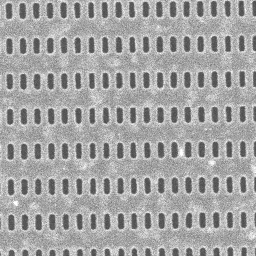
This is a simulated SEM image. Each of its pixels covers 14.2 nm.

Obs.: a regular array of holes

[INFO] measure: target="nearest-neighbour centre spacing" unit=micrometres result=0.19